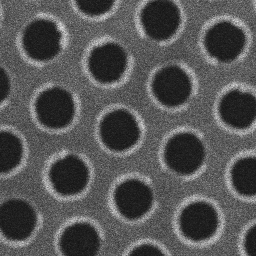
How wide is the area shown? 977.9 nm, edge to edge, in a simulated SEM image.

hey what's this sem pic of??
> a regular array of holes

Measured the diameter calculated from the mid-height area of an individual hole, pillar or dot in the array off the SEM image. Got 153 nm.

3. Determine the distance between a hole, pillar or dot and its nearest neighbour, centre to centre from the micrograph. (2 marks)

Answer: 261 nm